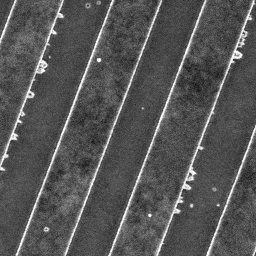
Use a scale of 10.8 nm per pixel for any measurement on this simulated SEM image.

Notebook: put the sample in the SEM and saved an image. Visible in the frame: lines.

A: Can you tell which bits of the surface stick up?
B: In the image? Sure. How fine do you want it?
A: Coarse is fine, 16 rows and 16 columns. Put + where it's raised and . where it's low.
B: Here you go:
.+++...+++...+++
+++...++++..+++.
+++...+++...+++.
+++...+++...+++.
++...+++...+++..
++...+++...+++..
++...+++..+++...
+...+++...+++...
+...+++...+++...
...++++..+++...+
...+++...+++...+
...+++..++++...+
..+++...+++...++
..+++...+++...++
..+++..+++...+++
.+++...+++...+++